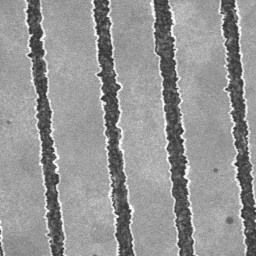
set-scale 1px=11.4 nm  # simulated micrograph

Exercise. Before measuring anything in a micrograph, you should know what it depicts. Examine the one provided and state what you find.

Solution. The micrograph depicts one or a few lines or trenches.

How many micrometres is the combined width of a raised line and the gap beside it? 0.73